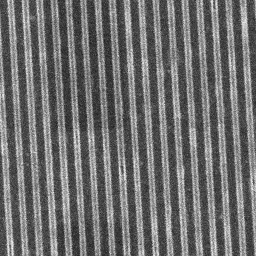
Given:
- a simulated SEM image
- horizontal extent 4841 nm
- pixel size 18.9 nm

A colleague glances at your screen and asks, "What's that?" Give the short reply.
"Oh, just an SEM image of parallel lines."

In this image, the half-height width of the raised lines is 104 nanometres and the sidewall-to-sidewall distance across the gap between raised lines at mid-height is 172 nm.